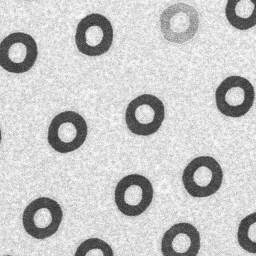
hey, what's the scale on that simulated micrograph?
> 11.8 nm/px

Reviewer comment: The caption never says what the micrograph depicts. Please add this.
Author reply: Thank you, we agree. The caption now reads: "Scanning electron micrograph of ring-shaped grooves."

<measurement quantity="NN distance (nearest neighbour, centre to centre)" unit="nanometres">936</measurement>